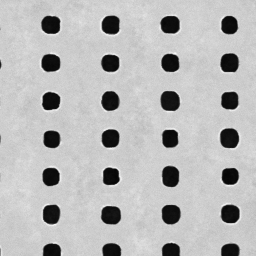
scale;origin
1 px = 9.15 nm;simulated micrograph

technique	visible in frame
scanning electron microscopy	a regular array of holes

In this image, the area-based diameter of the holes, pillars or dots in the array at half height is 171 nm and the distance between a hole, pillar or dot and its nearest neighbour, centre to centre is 37.5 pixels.